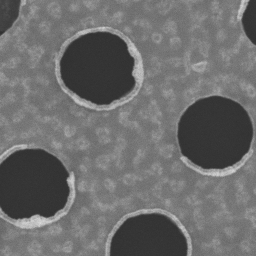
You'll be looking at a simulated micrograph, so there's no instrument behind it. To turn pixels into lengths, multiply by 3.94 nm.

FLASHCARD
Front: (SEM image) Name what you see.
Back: holes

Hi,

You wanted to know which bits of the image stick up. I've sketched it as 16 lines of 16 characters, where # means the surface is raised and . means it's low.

.##############.
.##############.
#####...########
####....########
####....########
####....########
######.#####...#
###########.....
###########.....
#..########....#
....#########.##
....############
....############
#..#####..######
#######....#####
#######.....####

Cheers